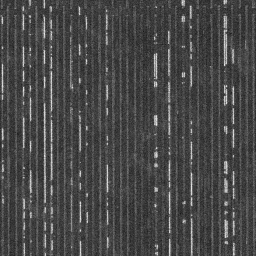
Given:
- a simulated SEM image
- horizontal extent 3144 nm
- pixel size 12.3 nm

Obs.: parallel lines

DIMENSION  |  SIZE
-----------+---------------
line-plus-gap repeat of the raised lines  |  7.01 px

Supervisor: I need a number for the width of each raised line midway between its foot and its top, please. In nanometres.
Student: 15.4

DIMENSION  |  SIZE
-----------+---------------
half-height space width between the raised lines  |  69.1 nm